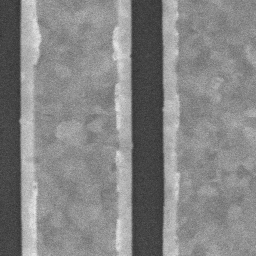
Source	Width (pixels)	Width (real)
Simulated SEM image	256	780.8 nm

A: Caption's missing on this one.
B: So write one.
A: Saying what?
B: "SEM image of one or a few lines or trenches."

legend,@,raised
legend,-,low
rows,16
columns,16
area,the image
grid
--@@@@@@---@@@@@
--@@@@@@---@@@@@
--@@@@@@---@@@@@
--@@@@@@---@@@@@
--@@@@@@---@@@@@
--@@@@@@---@@@@@
--@@@@@@---@@@@@
--@@@@@@---@@@@@
--@@@@@@---@@@@@
--@@@@@@---@@@@@
--@@@@@@---@@@@@
--@@@@@@---@@@@@
--@@@@@@---@@@@@
--@@@@@@---@@@@@
--@@@@@@---@@@@@
--@@@@@@---@@@@@